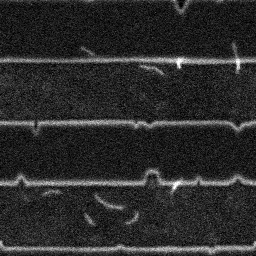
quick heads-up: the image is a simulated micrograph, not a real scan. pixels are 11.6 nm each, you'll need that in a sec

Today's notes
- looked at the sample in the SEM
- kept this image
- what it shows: one or a few lines or trenches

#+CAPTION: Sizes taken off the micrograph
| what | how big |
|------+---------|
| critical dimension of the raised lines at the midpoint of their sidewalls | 719 nm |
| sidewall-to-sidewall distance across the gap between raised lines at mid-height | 731 nm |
